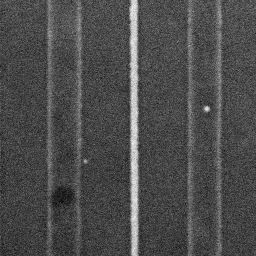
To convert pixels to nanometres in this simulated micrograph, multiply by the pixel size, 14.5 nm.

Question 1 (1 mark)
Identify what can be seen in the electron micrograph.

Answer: lines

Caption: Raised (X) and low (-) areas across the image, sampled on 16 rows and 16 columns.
---XX-------XX--
---XX-------XX--
---XX-------XX--
---XX-------XX--
---XX-------XX--
---XX-------XX--
---XX-------XX--
---XX-------XX--
---XX-------XX--
---XX-------XX--
---XX-------XX--
---XX-------XX--
---XX-------XX--
---XX-------XX--
---XX-------XX--
---XX-------XX--